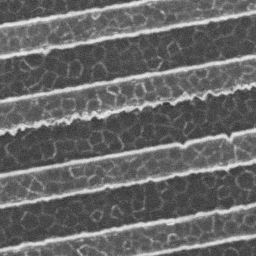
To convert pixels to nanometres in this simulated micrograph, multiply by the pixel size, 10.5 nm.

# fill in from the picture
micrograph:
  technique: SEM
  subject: one or a few lines or trenches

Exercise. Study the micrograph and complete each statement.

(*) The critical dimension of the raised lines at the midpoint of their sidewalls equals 320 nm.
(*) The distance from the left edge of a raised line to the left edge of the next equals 0.772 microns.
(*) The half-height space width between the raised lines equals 446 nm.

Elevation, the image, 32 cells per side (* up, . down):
................****************
...........*********************
....***********************.....
*********************...........
***************.................
**********......................
****.*..........................
.............................***
........................********
..................**************
............********************
.......**********************...
.**********************.........
****************................
*************...................
*****...........................
...............................*
.........................*******
...................*************
..............******************
........***********************.
..**********************........
*******************.............
*************...................
********........................
**..............................
...........................*****
......................**********
...............*****************
..........**********************
....**********************......
********************............